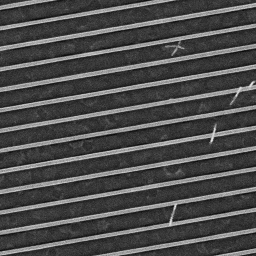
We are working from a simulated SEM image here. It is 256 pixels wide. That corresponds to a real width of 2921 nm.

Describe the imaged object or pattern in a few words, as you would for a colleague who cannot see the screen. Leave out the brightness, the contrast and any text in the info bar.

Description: parallel lines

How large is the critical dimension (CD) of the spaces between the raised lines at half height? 186 nm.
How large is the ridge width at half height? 40.8 nm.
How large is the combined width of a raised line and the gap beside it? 230 nm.